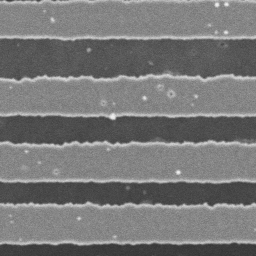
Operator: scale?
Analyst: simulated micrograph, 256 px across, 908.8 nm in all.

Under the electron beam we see lines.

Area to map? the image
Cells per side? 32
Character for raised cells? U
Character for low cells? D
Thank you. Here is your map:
UUUUUUUUUUUUUUUUUUUUUUUUUUUUUUUU
UUUUUUUUUUUUUUUUUUUUUUUUUUUUUUUU
UUUUUUUUUUUUUUUUUUUUUUUUUUUUUUUU
UUUUUUUUUUUUUUUUUUUUUUUUUUUUUUUU
UUUUUUUUUUUUUUUUUUUUUUUUUUUUUUUU
DDDDDDDDDDDDDDDDDDDDDDDDDDDDDDDD
DDDDDDDDDDDDDDDDDDDDDDDDDDDDDDDD
DDDDDDDDDDDDDDDDDDDDDDDDDDDDDDDD
DDDDDDDDDDDDDDDDDDDDDDDDDDDDDDDD
DDDDDDDDDDDDDDDDDDUUUUDDDDDUUDDD
UUUUUUUUUUUUUUUUUUUUUUUUUUUUUUUU
UUUUUUUUUUUUUUUUUUUUUUUUUUUUUUUU
UUUUUUUUUUUUUUUUUUUUUUUUUUUUUUUU
UUUUUUUUUUUUUUUUUUUUUUUUUUUUUUUU
UDDDDUDDUUUUUUUDDUUUUUUUUUUUUUUU
DDDDDDDDDDDDDDDDDDDDDDDDDDDDDDDD
DDDDDDDDDDDDDDDDDDDDDDDDDDDDDDDD
DDDDDDDDDDDDDDDDDDDDDDDDDDDDDDDD
UUUUUUUUUUUUUUUUUUUUUUUUUUUUUUUU
UUUUUUUUUUUUUUUUUUUUUUUUUUUUUUUU
UUUUUUUUUUUUUUUUUUUUUUUUUUUUUUUU
UUUUUUUUUUUUUUUUUUUUUUUUUUUUUUUU
UUUUUUUUUUUUUUUUUUUUUUUUUUUUUUUU
DDDDDDDDDDDDDDDDDDDDDDDDDDDDDDDD
DDDDDDDDDDDDDDDDDDDDDDDDDDDDDDDD
UUUUUDUDUUUUDDDDUDUDDDDDDUDUUDDU
UUUUUUUUUUUUUUUUUUUUUUUUUUUUUUUU
UUUUUUUUUUUUUUUUUUUUUUUUUUUUUUUU
UUUUUUUUUUUUUUUUUUUUUUUUUUUUUUUU
UUUUUUUUUUUUUUUUUUUUUUUUUUUUUUUU
DUUUDDUDDDUUDDDDUDDDDDUDDDDDDDDD
DDDDDDDDDDDDDDDDDDDDDDDDDDDDDDDD